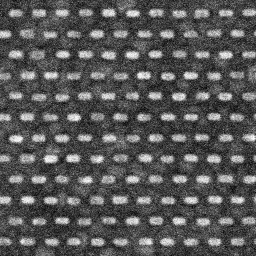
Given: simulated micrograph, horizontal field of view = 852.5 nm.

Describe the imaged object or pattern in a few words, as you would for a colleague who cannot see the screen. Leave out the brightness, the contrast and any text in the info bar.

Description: a regular array of raised bodies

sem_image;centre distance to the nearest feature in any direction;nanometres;76.7